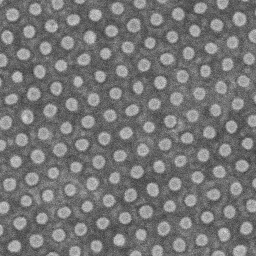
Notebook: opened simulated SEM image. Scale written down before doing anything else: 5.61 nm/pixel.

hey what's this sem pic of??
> a regular array of raised bodies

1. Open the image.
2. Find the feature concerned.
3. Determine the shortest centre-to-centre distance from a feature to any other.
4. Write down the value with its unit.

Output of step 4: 0.127 microns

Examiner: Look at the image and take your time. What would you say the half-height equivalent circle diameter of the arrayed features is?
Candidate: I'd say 66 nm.